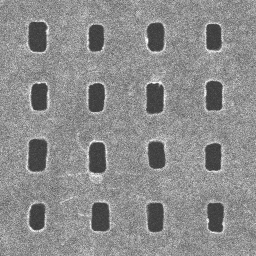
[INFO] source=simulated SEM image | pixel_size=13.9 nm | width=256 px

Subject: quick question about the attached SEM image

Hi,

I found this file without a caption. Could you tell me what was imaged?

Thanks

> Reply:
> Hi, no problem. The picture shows a regular array of holes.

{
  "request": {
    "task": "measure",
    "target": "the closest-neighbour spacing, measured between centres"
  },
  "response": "806 nm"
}